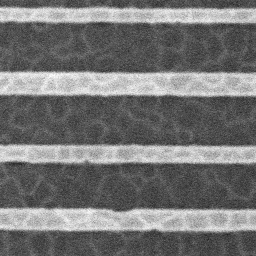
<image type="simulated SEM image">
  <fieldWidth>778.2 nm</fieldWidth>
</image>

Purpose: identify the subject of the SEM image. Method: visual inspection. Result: one or a few lines or trenches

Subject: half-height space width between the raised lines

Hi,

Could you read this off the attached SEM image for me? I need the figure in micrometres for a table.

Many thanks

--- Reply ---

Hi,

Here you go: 0.158